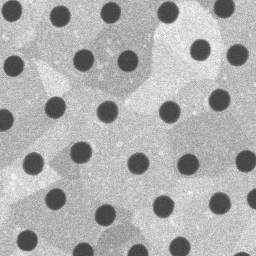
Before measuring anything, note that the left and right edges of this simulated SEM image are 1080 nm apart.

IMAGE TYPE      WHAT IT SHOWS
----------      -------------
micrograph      a regular array of holes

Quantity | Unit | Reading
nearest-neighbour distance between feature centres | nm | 207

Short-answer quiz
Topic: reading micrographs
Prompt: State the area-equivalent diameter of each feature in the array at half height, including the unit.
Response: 87.5 nanometres